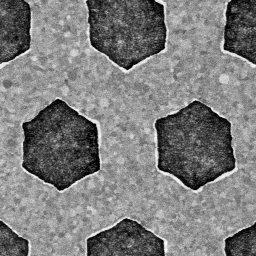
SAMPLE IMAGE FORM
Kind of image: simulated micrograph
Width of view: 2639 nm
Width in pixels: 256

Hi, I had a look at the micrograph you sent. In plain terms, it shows holes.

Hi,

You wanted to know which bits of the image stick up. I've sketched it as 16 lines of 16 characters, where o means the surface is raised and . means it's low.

..ooo.....oooo..
..oooo....oooo..
..oooo....oooo..
.oooooo...ooooo.
oooooooooooooooo
oooooooooooooooo
ooo.oooooooo.ooo
oo....oooo....oo
oo....oooo.....o
o.....oooo.....o
oo....oooo.....o
ooo..oooooo..ooo
oooooooooooooooo
oooooooooooooooo
.ooooo...oooooo.
..ooo.....oooo..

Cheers